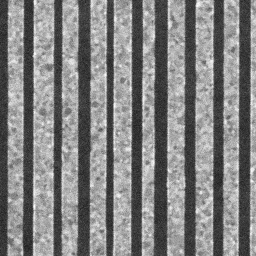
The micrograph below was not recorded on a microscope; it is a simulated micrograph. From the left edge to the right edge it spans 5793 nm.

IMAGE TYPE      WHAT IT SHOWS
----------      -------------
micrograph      parallel lines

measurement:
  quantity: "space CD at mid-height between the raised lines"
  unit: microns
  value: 0.269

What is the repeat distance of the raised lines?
610 nanometres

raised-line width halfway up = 339 nanometers